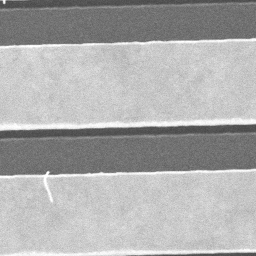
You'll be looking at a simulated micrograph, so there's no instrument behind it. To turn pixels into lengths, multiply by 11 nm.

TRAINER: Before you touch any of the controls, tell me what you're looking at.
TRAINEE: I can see lines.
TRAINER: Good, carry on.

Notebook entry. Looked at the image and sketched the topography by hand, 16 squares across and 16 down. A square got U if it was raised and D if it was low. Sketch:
DDDDDDDDDDDDDDDD
DDDDDDDDDDDDDDDD
DDDDDDDDDDDDDDUU
UUUUUUUUUUUUUUUU
UUUUUUUUUUUUUUUU
UUUUUUUUUUUUUUUU
UUUUUUUUUUUUUUUU
UUUUUUUUUUUUUUUU
DDDDDDDDDDDDDDDD
DDDDDDDDDDDDDDDD
DDDDDDDDDDDDDDDD
UUUUUUUUUUUUUUUU
UUUUUUUUUUUUUUUU
UUUUUUUUUUUUUUUU
UUUUUUUUUUUUUUUU
UUUUUUUUUUUUUUUU